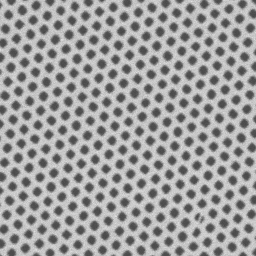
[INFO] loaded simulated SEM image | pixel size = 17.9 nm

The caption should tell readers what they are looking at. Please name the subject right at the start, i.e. a regular array of holes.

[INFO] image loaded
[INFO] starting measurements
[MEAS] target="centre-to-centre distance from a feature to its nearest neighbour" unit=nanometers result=256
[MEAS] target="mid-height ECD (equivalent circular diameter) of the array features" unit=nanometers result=172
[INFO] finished